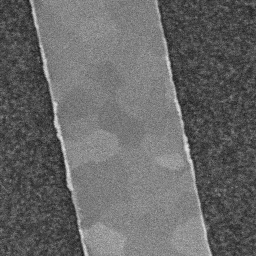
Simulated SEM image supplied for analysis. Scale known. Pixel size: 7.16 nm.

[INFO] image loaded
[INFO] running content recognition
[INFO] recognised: one or a few lines or trenches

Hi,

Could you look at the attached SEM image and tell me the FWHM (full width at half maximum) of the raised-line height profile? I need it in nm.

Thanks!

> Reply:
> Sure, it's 880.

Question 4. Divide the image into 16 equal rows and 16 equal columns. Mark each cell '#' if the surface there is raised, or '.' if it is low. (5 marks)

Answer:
..########......
..########......
..########......
...#######......
...########.....
...########.....
...########.....
...########.....
....########....
....########....
....########....
....########....
.....#######....
.....########...
.....########...
.....########...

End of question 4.